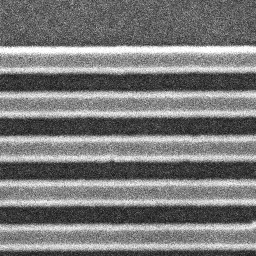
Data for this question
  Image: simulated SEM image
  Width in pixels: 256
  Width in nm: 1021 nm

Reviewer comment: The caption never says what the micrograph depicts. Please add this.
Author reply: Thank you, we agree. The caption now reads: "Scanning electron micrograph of parallel lines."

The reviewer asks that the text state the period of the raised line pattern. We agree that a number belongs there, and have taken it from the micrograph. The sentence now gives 176 nm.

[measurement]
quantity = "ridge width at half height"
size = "0.0897 µm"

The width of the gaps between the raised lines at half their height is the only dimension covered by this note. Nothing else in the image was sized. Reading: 89.7 nanometres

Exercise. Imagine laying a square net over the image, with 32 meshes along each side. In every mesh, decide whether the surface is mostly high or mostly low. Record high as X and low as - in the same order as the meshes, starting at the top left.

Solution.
--------------------------------
--------------------------------
--------------------------------
--------------------------------
--------------------------------
--------------------------------
XXXXXXXXXXXXXXXXXXXXXXXXXXXXXXXX
XXXXXXXXXXXXXXXXXXXXXXXXXXXXXXXX
XXXXXXXXXXXXXXXXXXXXXXXXXXXXXXXX
--------------------------------
--------------------------------
--------------------------------
XXXXXXXXXXXXXXXXXXXXXXXXXXXXXXXX
XXXXXXXXXXXXXXXXXXXXXXXXXXXXXXXX
-XX-----------------------------
--------------------------------
--------------------------------
XXXXXXXXXXXXXXXXXXXXXXXXXXXXXXXX
XXXXXXXXXXXXXXXXXXXXXXXXXXXXXXXX
XXXXXXXXXXXXXXXXXXXXXXXXXXXXXXXX
--------------------------------
--------------------------------
--------------------------------
XXXXXXXXXXXXXXXXXXXXXXXXXXXXXXXX
XXXXXXXXXXXXXXXXXXXXXXXXXXXXXXXX
XXXXXXXX--XX--XXXXXX-X----------
--------------------------------
--------------------------------
XXXXXXXXXXXXXXXXXXXXXXXXXXXXXXXX
XXXXXXXXXXXXXXXXXXXXXXXXXXXXXXXX
XXXXXXXXXXXXXXXXXXXXXXXXXXXXXXXX
--------------------------------